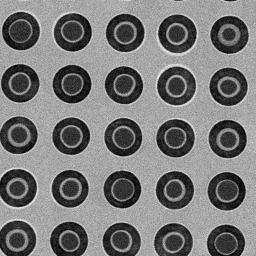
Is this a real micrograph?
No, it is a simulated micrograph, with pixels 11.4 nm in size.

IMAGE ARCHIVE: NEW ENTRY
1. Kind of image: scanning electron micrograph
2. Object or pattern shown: an array of small figures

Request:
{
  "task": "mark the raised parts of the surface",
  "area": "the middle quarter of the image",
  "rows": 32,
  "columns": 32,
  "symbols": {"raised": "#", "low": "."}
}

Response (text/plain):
....##########..###########...##
.....#######......#######......#
......#####........#####........
####...###...####..####....##...
#####..###...####...###...####..
#####..###...####...###...####..
####...###...####...###...####..
.##...#####...##...#####...###..
.....######........#####........
....#########.....#######......#
###########################..###
################################
################################
...###########..################
.....#######......#######......#
.##...#####........#####........
####..####...####..####...###...
####...###..#####..####..#####..
####...###..######..###..#####..
####..####...####..####..#####..
.##...#####..####..####...###...
.....######........#####........
....#########....########......#
################################
################################
################################
..############.#################
.....#######.....########......#
......#####.......######.......#
####..####...####..####...###...
####..####..#####..####..#####..
####..####..#####..####..#####..